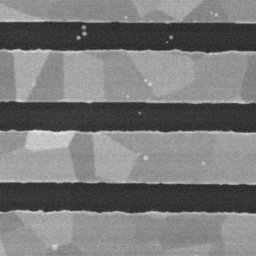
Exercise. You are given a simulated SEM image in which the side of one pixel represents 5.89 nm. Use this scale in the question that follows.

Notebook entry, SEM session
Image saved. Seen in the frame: lines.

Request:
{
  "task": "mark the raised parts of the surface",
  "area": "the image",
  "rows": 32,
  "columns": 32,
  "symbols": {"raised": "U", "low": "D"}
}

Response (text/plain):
UUUUUUUUUUUUUUUUUUUUUUUUUUUUUUUU
UUUUUUUUUUUUUUUUUUUUUUUUUUUUUUUU
UUUUUUUUUUUUUUUUUUUUUUUUUUUUUUUU
DDDDDDDDDDDDDDDDDDDDDDDDDDDDDDDD
DDDDDDDDDDDDDDDDDDDDDDDDDDDDDDDD
DDDDDDDDDDDDDDDDDDDDDDDDDDDDDDDD
UUUUUUUUUUUUUUUUUUUUUUUDDDDDUUDD
UUUUUUUUUUUUUUUUUUUUUUUUUUUUUUUU
UUUUUUUUUUUUUUUUUUUUUUUUUUUUUUUU
UUUUUUUUUUUUUUUUUUUUUUUUUUUUUUUU
UUUUUUUUUUUUUUUUUUUUUUUUUUUUUUUU
UUUUUUUUUUUUUUUUUUUUUUUUUUUUUUUU
UUUUUUUUUUUUUUUUUUUUUUUUUUUUUUUU
DDDDDDDDDDDDDDDDDDDDDDDDDDDDDDDD
DDDDDDDDDDDDDDDDDDDDDDDDDDDDDDDD
DDDDDDDDDDDDDDDDDDDDDDDDDDDDDDDD
UUUUUUDDUUDDUUUUUUUUDDUUUUUUUDDD
UUUUUUUUUUUUUUUUUUUUUUUUUUUUUUUU
UUUUUUUUUUUUUUUUUUUUUUUUUUUUUUUU
UUUUUUUUUUUUUUUUUUUUUUUUUUUUUUUU
UUUUUUUUUUUUUUUUUUUUUUUUUUUUUUUU
UUUUUUUUUUUUUUUUUUUUUUUUUUUUUUUU
UUUUUUUUUUUUUUUUUUUUUUUUUUUUUUUU
DDDDDDDDDDDDDDDDDDDDDDDDDDDDDDDD
DDDDDDDDDDDDDDDDDDDDDDDDDDDDDDDD
DDDDDDDDDDDDDDDDDDDDDDDDDDDDDDDD
DUUUUUUUUUUDDDUDDDDUDDDDDDDDDDDD
UUUUUUUUUUUUUUUUUUUUUUUUUUUUUUUU
UUUUUUUUUUUUUUUUUUUUUUUUUUUUUUUU
UUUUUUUUUUUUUUUUUUUUUUUUUUUUUUUU
UUUUUUUUUUUUUUUUUUUUUUUUUUUUUUUU
UUUUUUUUUUUUUUUUUUUUUUUUUUUUUUUU